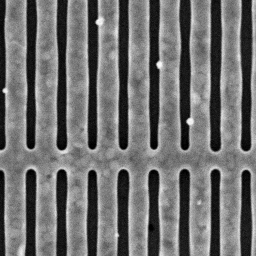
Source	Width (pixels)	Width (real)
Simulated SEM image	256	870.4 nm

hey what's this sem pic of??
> groups of lines, slits or small figures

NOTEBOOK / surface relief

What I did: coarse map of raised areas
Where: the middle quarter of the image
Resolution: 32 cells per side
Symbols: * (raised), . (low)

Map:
.*****...****...*****..******...
.*****...****...*****...*****...
.*****...****...*****...*****...
.*****...****...*****...*****...
.*****...*****..*****...*****...
.*****...*****..*****...*****...
.*****...*****..*****...*****...
.*****...****...*****...*****...
.*****...****...*****...*****...
.*****...****...*****...*****...
.*****...****...*****...*****...
.*****...****...*****...*****...
.*****...****...*****...*****...
.*****...****...*****...*****..*
.*****...****...*****...*****..*
.*****...****...*****...*****..*
.*****...****...*****...*****..*
.*****...****...*****...*****..*
.*****...****...*****...*****..*
.*****...****...*****...*****..*
.*****..******..*****...*****..*
**********************.*******.*
********************************
********************************
********************************
********************************
**************..******.******..*
.*****..*****...*****...*****..*
.*****...****...*****...*****...
.*****...****...*****...*****...
.*****...****...*****...*****...
.*****...****...*****...*****...